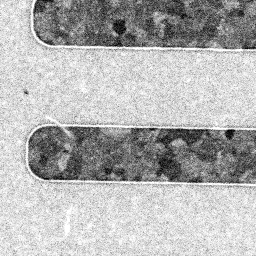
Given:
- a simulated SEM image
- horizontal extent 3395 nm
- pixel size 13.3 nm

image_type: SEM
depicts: one or a few lines or trenches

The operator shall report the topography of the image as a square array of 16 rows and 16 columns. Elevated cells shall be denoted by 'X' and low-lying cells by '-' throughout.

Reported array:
--XXXXXXXXXXXXXX
--XXXXXXXXXXXXXX
--XXXXXXXXXXXXXX
----------------
----------------
----------------
----------------
----------------
--XXXXXXXXXXXXXX
--XXXXXXXXXXXXXX
--XXXXXXXXXXXXXX
-------------XXX
----------------
----------------
----------------
----------------